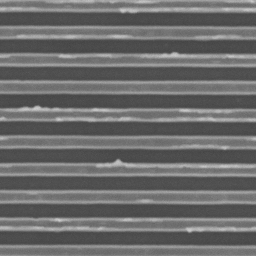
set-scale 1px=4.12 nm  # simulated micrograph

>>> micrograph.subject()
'parallel lines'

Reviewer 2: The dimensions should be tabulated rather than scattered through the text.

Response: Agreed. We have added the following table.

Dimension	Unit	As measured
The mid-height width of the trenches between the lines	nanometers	65.9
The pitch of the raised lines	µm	0.113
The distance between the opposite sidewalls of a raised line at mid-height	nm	46.8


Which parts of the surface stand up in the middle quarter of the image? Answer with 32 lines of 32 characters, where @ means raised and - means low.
--------------------------------
--------------------------------
--------------------------------
--------------------------------
@@@@@@@@@@@@--------------------
@@@@@@@@@@@@@@@@@@@@@@@@@@@@@@@@
@@@@@@@@@@@@@@@@@@@@@@@@@@@@@@@@
--------------------------------
--------------------------------
--------------------------------
--------------------------------
@@@@@@@@@@@-----@@@--@@@@--@@@@@
@@@@@@@@@@@@@@@@@@@@@@@@@@@@@@@@
@@@@@@@@@@@@@@@@@@@@@@@@@@@@@@@@
--------------------------------
--------------------------------
--------------------------------
--------------------------------
@@@@@@@@@@@@@@@@@@@@@@@@@@@@@@@@
@@@@@@@@@@@@@@@@@@@@@@@@@@@@@@@@
@@@@@@@@@@@@@@@@@@@@@@@@@@@@@@@@
--------------------------------
--------------------------------
--------------------------------
-------------@------------------
@@@@@@@@@@@@@@@@@@@@@@@@@@@@@@@@
@@@@@@@@@@@@@@@@@@@@@@@@@@@@@@@@
@@@@@@@@@@@@@@@@@@@@@@@@@@@@@@@@
--------------------------------
--------------------------------
--------------------------------
--------------------------------